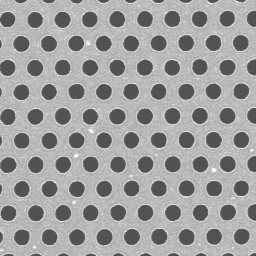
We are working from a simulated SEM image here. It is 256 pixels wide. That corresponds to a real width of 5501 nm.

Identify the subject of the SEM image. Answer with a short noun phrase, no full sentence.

a regular array of holes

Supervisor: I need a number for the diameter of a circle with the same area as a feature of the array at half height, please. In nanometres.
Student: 349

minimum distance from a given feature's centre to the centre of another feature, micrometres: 0.586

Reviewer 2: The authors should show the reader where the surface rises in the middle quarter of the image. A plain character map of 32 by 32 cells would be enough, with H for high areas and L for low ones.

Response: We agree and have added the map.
LLHHHLLLHHHLLLLHHHLLLLHHHLLLLHHH
LHHHHLLLLHHHLLLHHHLLLLHHHLLLLHHH
LHHHHLLLHHHHLLLHHHHLLHHHHHLLHHHH
HHHHHHHHHHHHHHHHHHHHHHHHHHHHHHHH
HHHHHHHHHHHHHHHHHHHHHHHHHHHHHHHH
HHLLLHHHHLLHHHHLLLHHHHLLLHHHHLLL
HLLLLHHHLLLLHHHLLLLHHHLLLLHHHLLL
HLLLLHHHLLLLHHHLLLLHHHLLLHHHHLLL
HHLLLHHHHLLHHHHHLLHHHHLLLHHHHLLL
HHHHHHHHHHHHHHHHHHHHHHHHHHHHHHHH
HHHHHHHHHHHHHHHHHHHHHHHHHHHHHHHH
LHHHHLLLHHHHLLLHHHHLLLHHHHLLLHHH
LLHHHLLLHHHLLLLHHHLLLLHHHLLLLHHH
LLHHHLLLLHHLLLLHHHLLLLHHHLLLLHHH
LHHHHLLLHHHHLLLHHHHLLLHHHHLLLHHH
HHHHHHHHHHHHHHHHHHHHHHHHHHHHHHHH
HHHHHHHHHHHHHHHHHHHHHHHHHHHHHHHH
HHLLHHHHHLLHHHHHLLHHHHLLLHHHHLLL
HLLLLHHHLLLLHHHLLLLHHHLLLLHHHLLL
HLLLLHHHLLLLHHHLLLLHHHLLLLHHHLLL
HHLLLHHHHLLHHHHLLLHHHHLLLHHHHLLL
HHHHHHHHHHHHHHHHHHHHHHHHHHHHHHHH
HHHHHHHHHHHHHHHHHHHHHHHHHHHHHHHH
LHHHHLLLHHHHLLLHHHHLLLHHHHLLLHHH
LLHHHLLLLHHHLLLHHHLLLLHHHLLLLHHH
LLHHHLLLLHHLLLLHHHLLLLHHHLLLLHHH
LHHHHLLLHHHHLLLHHHHLLLHHHHLLLHHH
HHHHHHHHHHHHHHHHHHHHHHHHHHHHHHHH
HHHHHHHHHHHHHHHHHHHHHHHHHHHHHHHH
HHLLHHHHHLLHHHHHLLHHHHLLLHHHHLLL
HLLLLHHHLLLLHHHLLLLHHHLLLLHHHLLL
HLLLLHHHLLLLHHHLLLLHHHLLLLHHHLLL